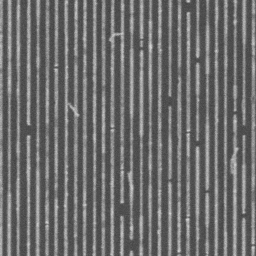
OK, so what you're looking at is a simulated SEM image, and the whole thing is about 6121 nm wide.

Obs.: parallel lines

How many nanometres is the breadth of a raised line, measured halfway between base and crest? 44.8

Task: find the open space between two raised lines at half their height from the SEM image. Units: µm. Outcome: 0.17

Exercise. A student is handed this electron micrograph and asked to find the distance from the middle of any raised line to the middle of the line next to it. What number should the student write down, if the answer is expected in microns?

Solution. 0.225